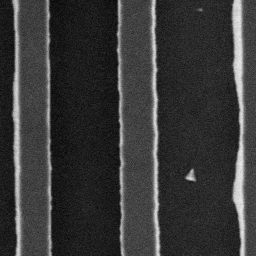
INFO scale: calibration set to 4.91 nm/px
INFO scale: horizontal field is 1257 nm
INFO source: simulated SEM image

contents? lines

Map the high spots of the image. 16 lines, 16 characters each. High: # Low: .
.##....###.....#
.##....###.....#
.##....###.....#
.##....###.....#
.##....###.....#
.##....###.....#
.##....###.....#
.##.....##.....#
.##.....##.....#
.##.....##.....#
.##.....##.....#
.##.....##.....#
.##.....##.....#
.##.....##.....#
.##.....##.....#
.##.....##.....#